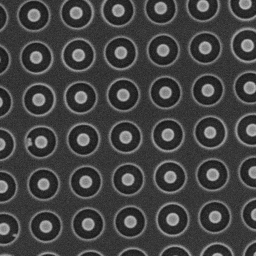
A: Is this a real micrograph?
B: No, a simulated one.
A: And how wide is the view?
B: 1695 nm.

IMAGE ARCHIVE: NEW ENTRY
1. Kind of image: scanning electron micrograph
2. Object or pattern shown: an array of small figures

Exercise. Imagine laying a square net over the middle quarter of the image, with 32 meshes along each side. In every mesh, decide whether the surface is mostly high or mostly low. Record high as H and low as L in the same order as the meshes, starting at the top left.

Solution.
HLLLLLHHHHHHLLLLHHHHHHHHHHHHHHHH
HHHLHHHHHHHHHHHHHHHHHHHHHHHHHHHH
HHHHHHHHHHHHHHHHHHHHHHHHHHHHHHHH
HHHHHHHHHHHHHHHHHHHHHHHHLLHHHHHH
HHHHHHHHHHHHHLLLLHHHHHHLLLLLHHHH
HHLLLLLHHHHHLLLLLLHHHHLLLLLLLHHH
HLLLLLLHHHHLLLHLLLHHHHLLLLLLLHHH
LLLHHLLLHHHLLHHHLLLHHHLLLLLLLHHH
LLLHHHLLHHHLLLHHLLLHHHLLLLLLLHHH
HLLHHLLLHHHLLLLLLLHHHHLLLLLLHHHH
HLLLLLLHHHHHLLLLLHHHHHHHLLLHHHHH
HHLLLLHHHHHHHHLLHHHHHHHHHHHHHHHH
HHHHHHHHHHHHHHHHHHHHHHHHHHHHHHHH
HHHHHHHHHHHHHHHHHHHHHHHHHHHHHHHH
HHHHHHHHHHHHHHHLHHHHHHHHLLLLHHHH
HHHLLLLHHHHHHLLLLLHHHHHLLLLLLHHH
HHLLLLLLHHHHLLLLLLLHHHLLLLLLLLHH
HLLLLLLLHHHHLLLLLLLHHHLLLLLLLLHH
HLLHHHLLLHHHLLLLLLLHHHLLLLLLLLHH
HLLHHHLLLHHHLLLLLLLHHHHLLLLLLHHH
HLLLLLLLHHHHLLLLLLLHHHHLLLLLLHHH
HHLLLLLLHHHHHLLLLHHHHHHHHLLHHHHH
HHHHLLHHHHHHHHHHHHHHHHHHHHHHHHHH
HHHHHHHHHHHHHHHHHHHHHHHHHHHHHHHH
HHHHHHHHHHHHHHHHHHHHHHHHHHLHHHHH
HHHHHHHHHHHHHHLLLLHHHHHHLLLLLHHH
HHHLLLLLHHHHHLLLLLLHHHHLLLLLLLHH
HHLLLLLLLHHHHLLLLLLLHHHLLLLLLLHH
HHLLLLLLLHHHLLLLLLLLHHHLLLLLLLHH
HHLLLLLLLHHHLLLLLLLLHHHLLLLLLLHH
HHLLLLLLLHHHHLLLLLLHHHHHLLLLLLHH
HHLLLLLLLHHHHLLLLLLHHHHHHLLLHHHH